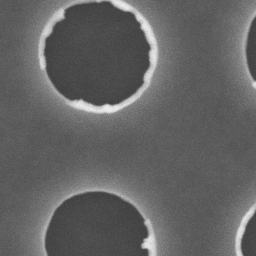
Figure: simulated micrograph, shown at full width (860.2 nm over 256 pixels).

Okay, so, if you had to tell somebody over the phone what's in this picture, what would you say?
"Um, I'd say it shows holes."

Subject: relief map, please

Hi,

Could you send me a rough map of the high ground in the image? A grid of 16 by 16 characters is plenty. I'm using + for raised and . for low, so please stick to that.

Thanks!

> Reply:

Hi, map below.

++++...+++++++++
++++.....+++++++
+++......++++++.
+++......++++++.
+++......+++++++
+++......+++++++
++++++.+++++++++
++++++++++++++++
++++++++++++++++
++++++++++++++++
++++++++++++++++
++++++++++++++++
++++....++++++++
+++......+++++++
+++......++++++.
+++......++++++.